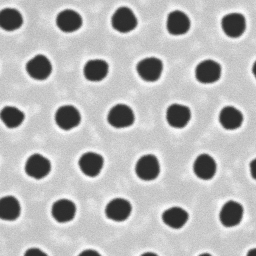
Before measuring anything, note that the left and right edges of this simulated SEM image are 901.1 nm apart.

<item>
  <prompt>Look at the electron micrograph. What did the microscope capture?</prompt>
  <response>a regular array of holes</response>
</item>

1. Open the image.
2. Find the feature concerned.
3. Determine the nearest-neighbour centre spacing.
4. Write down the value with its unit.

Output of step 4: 185 nm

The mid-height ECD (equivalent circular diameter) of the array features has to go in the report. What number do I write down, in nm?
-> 88.5